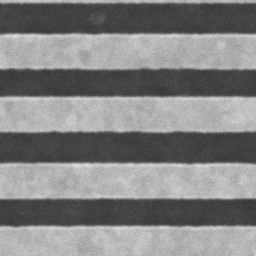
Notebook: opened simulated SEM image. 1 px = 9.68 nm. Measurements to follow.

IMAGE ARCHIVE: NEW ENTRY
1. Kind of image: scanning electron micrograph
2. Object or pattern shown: lines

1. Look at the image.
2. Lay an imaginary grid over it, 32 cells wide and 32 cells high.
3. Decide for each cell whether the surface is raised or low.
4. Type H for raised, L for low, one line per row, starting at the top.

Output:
LLLLLLLLLLLLLLLLLLLLLLLLLLLLLLLL
LLLLLLLLLLLLLLLLLLLLLLLLLLLLLLLL
LLLLLLLLLLLLLLLLLLLLLLLLLLLLLLLL
LLLLLLLLLLLLLLLLLLLLLLLLLLLLLLLL
HHHHHHHHHHHHHHHHHHHHHHHHHHHHHHHH
HHHHHHHHHHHHHHHHHHHHHHHHHHHHHHHH
HHHHHHHHHHHHHHHHHHHHHHHHHHHHHHHH
HHHHHHHHHHHHHHHHHHHHHHHHHHHHHHHH
HLLLLLLLLLHHHHHHHHLHLLLLLHHLHLLH
LLLLLLLLLLLLLLLLLLLLLLLLLLLLLLLL
LLLLLLLLLLLLLLLLLLLLLLLLLLLLLLLL
LLLLLLLLLLLLLLLLLLLLLLLLLLLLLLLL
HHHHHHHHHHHHHHHHHHHHHHHHHHHHHHHH
HHHHHHHHHHHHHHHHHHHHHHHHHHHHHHHH
HHHHHHHHHHHHHHHHHHHHHHHHHHHHHHHH
HHHHHHHHHHHHHHHHHHHHHHHHHHHHHHHH
LLLLLLLLLLLLLLLLLLLLLLLLLLLLLLLL
LLLLLLLLLLLLLLLLLLLLLLLLLLLLLLLL
LLLLLLLLLLLLLLLLLLLLLLLLLLLLLLLL
LLLLLLLLLLLLLLLLLLLLLLLLLLLLLLLL
LLLLLLLLLLLLLLLLLLLLLLLLLLLLLLLL
HHHHHHHHHHHHHHHHHHHHHHHHHHHHHHHH
HHHHHHHHHHHHHHHHHHHHHHHHHHHHHHHH
HHHHHHHHHHHHHHHHHHHHHHHHHHHHHHHH
HHHHHHHHHHHHHHHHHHHHHHHHHHHHHHHH
LLLLLLLLLLLLLLLLLLLLLLLLLLLLLLLL
LLLLLLLLLLLLLLLLLLLLLLLLLLLLLLLL
LLLLLLLLLLLLLLLLLLLLLLLLLLLLLLLL
HLLHHHHHLHHHHHHHHHHHHHLLLHHHHHHH
HHHHHHHHHHHHHHHHHHHHHHHHHHHHHHHH
HHHHHHHHHHHHHHHHHHHHHHHHHHHHHHHH
HHHHHHHHHHHHHHHHHHHHHHHHHHHHHHHH